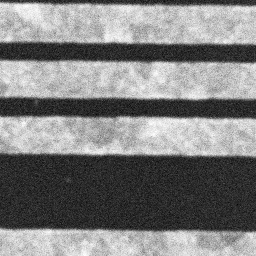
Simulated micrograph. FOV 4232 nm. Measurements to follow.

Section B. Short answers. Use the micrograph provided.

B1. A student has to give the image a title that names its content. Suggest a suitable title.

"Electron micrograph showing wiring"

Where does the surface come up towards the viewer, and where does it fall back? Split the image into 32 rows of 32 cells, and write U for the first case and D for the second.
DDDDDDDDDDDDDDDDDDDDDDDDDDDDDDDD
UUUUUUUUUUUUUUUUUUUUUUUUUUUUUUUU
UUUUUUUUUUUUUUUUUUUUUUUUUUUUUUUU
UUUUUUUUUUUUUUUUUUUUUUUUUUUUUUUU
UUUUUUUUUUUUUUUUUUUUUUUUUUUUUUUU
DDDDDDDDDDDDDDDDDDDDDDDDDDDDDDDD
DDDDDDDDDDDDDDDDDDDDDDDDDDDDDDDD
DDDDDDDDDDDDDDDDDDDDDDDDDDDDDDDD
UUUUUUUUUUUUUUUUUUUUUUUUUUUUUUUU
UUUUUUUUUUUUUUUUUUUUUUUUUUUUUUUU
UUUUUUUUUUUUUUUUUUUUUUUUUUUUUUUU
UUUUUUUUUUUUUUUUUUUUUUUUUUUUUUUU
DDDDDDDDDDDDDDDDDDDDDDDDDDDDDDDD
DDDDDDDDDDDDDDDDDDDDDDDDDDDDDDDD
DDDDDDDDDDDDDDDDDDDDDDDDDDDDDDDD
UUUUUUUUUUUUUUUUUUUUUUUUUUUUUUUU
UUUUUUUUUUUUUUUUUUUUUUUUUUUUUUUU
UUUUUUUUUUUUUUUUUUUUUUUUUUUUUUUU
UUUUUUUUUUUUUUUUUUUUUUUUUUUUUUUU
DDDDDDDDDDDDDDDDDDDDDDDDDDDDDDDD
DDDDDDDDDDDDDDDDDDDDDDDDDDDDDDDD
DDDDDDDDDDDDDDDDDDDDDDDDDDDDDDDD
DDDDDDDDDDDDDDDDDDDDDDDDDDDDDDDD
DDDDDDDDDDDDDDDDDDDDDDDDDDDDDDDD
DDDDDDDDDDDDDDDDDDDDDDDDDDDDDDDD
DDDDDDDDDDDDDDDDDDDDDDDDDDDDDDDD
DDDDDDDDDDDDDDDDDDDDDDDDDDDDDDDD
DDDDDDDDDDDDDDDDDDDDDDDDDDDDDDDD
DDDDDDDDDDDDDDDDDDDDDDDDDDDDDDDD
UUUUUUUUUUUUUUUUUUUUUUUUUUUUUUUU
UUUUUUUUUUUUUUUUUUUUUUUUUUUUUUUU
UUUUUUUUUUUUUUUUUUUUUUUUUUUUUUUU